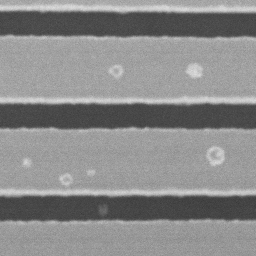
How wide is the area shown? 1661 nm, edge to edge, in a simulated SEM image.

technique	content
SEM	lines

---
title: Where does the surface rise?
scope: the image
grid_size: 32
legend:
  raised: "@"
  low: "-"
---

@@@@@@@@@@@@@@@@@@@@@@@@@@@@@@@@
----------------------@-@@@@@@@@
--------------------------------
--------------------------------
@@-@----------------------------
@@@@@@@@@@@@@@@@@@@@@@@@@@@@@@@@
@@@@@@@@@@@@@@@@@@@@@@@@@@@@@@@@
@@@@@@@@@@@@@@@@@@@@@@@@@@@@@@@@
@@@@@@@@@@@@@@@@@@@@@@@@@@@@@@@@
@@@@@@@@@@@@@@@@@@@@@@@@@@@@@@@@
@@@@@@@@@@@@@@@@@@@@@@@@@@@@@@@@
@@@@@@@@@@@@@@@@@@@@@@@@@@@@@@@@
@@@@@@@@@@@@@@@@@@@@@@@@@@@@@@@@
--------------------------------
--------------------------------
--------------------------------
@@@@@@@@@@@@@@@@@@@@@@@@@@@@@@@@
@@@@@@@@@@@@@@@@@@@@@@@@@@@@@@@@
@@@@@@@@@@@@@@@@@@@@@@@@@@@@@@@@
@@@@@@@@@@@@@@@@@@@@@@@@@@@@@@@@
@@@@@@@@@@@@@@@@@@@@@@@@@@@@@@@@
@@@@@@@@@@@@@@@@@@@@@@@@@@@@@@@@
@@@@@@@@@@@@@@@@@@@@@@@@@@@@@@@@
@@@@@@@@@@@@@@@@@@@@@@@@@@@@@@@@
--------------------------------
--------------------------------
--------------------------------
--------------------------@-----
@@@@@@@@@@@@@@@@@@@@@@@@@@@@@@@@
@@@@@@@@@@@@@@@@@@@@@@@@@@@@@@@@
@@@@@@@@@@@@@@@@@@@@@@@@@@@@@@@@
@@@@@@@@@@@@@@@@@@@@@@@@@@@@@@@@